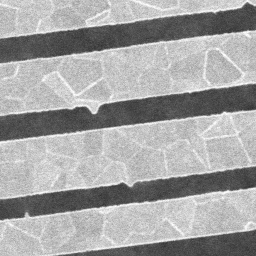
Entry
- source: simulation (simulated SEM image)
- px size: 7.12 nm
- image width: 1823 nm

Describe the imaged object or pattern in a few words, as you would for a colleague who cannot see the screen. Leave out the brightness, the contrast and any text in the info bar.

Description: one or a few lines or trenches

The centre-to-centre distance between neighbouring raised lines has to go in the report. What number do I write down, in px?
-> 76.1